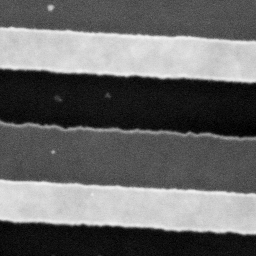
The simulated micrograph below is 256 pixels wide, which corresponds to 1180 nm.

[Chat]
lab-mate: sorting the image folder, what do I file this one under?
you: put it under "lines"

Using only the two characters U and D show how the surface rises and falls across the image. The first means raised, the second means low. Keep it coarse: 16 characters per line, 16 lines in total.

UUUUUUUUUUUUUUUU
UUUUUUUUUUUUUUUU
UUUUUUUUUUUUUUUU
UUUUUUUUUUUUUUUU
DDDDUUUUUUUUUUUU
DDDDDDDDDDDDDDDD
DDDDDDDDDDDDDDDD
DDDDDDDDDDDDDDDD
UUUUUUUUUUUUUUDD
UUUUUUUUUUUUUUUU
UUUUUUUUUUUUUUUU
UUUUUUUUUUUUUUUU
UUUUUUUUUUUUUUUU
UUUUUUUUUUUUUUUU
DDDDDDDDDDDDDDUU
DDDDDDDDDDDDDDDD